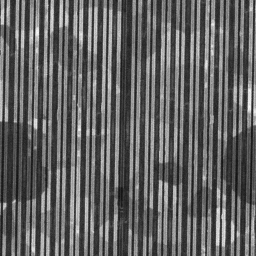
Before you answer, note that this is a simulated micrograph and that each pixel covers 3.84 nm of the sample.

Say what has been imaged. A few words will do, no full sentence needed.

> parallel lines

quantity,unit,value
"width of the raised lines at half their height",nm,11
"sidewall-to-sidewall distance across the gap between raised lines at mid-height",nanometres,21.6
